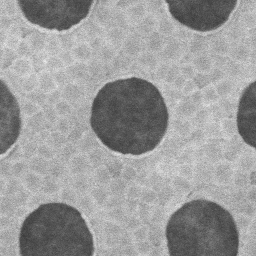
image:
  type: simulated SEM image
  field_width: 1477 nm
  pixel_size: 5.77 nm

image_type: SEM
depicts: holes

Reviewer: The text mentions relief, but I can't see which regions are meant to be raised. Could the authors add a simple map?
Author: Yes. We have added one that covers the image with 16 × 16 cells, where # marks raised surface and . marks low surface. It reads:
#.....#####....#
##...######...##
################
################
################
######....#####.
.#####....#####.
.#####....#####.
.#####....#####.
#######..#######
################
################
################
##...######...##
#.....####.....#
#.....#####....#